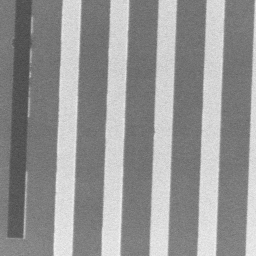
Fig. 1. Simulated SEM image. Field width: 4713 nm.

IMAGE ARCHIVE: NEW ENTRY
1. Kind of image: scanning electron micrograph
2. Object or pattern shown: parallel lines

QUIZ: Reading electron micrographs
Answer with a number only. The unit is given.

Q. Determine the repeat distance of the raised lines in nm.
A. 883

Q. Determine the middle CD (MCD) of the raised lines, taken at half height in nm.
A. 324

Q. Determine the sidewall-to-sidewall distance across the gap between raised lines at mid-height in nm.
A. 556